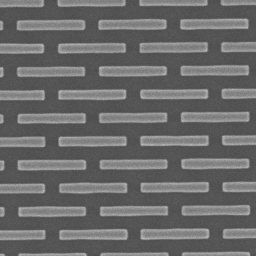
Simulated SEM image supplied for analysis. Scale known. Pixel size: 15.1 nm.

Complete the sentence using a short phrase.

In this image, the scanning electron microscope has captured groups of lines, slits or small figures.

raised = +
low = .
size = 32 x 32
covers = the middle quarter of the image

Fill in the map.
................................
+++++....+++++++++++++++++...+++
+++++....++++++++++++++++....+++
................................
................................
................................
..............................++
+++++++++++++++....+++++++++++++
+++++++++++++++.....++++++++++++
................................
................................
................................
..+++....+++++++++++++++++...+++
+++++....+++++++++++++++++...+++
+++++....+++++++.++++++.........
................................
................................
................................
+++++++++++++++....+++++++++++++
+++++++++++++++....+++++++++++++
+....++++.......................
................................
................................
................................
+++++....+++++++++++++++++...+++
+++++....+++++++++++++++++...+++
................................
................................
................................
................................
++++++++++++++++...+++++++++++++
++++++++++++++++...+++++++++++++